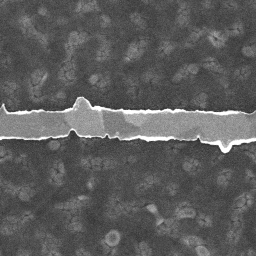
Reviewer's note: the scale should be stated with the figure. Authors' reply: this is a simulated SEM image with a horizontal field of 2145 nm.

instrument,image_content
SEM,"one or a few lines or trenches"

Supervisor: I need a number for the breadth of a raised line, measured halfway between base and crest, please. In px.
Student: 28.1